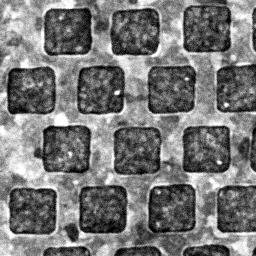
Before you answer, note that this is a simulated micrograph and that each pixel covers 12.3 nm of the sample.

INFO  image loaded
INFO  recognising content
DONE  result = a regular array of holes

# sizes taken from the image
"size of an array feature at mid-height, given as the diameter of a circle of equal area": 659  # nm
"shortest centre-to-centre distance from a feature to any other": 0.83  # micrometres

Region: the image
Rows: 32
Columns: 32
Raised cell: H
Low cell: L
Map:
HHHHHHHHHHHHHHHHHHHHHHHHHHHHHHHH
HHHHHHLLLLLHHHLLLLLLHHHLLLLLLHHH
HHHHHLLLLLLLHHLLLLLLHHHLLLLLLHHL
HHHHHLLLLLLHHHLLLLLLHHHLLLLLLHHL
HHHHHLLLLLLLHHLLLLLLHHHLLLLLLHHL
HHHHHLLLLLLLHHLLLLLLHHHLLLLLLHHL
HHHHHHLLLLLHHHLLLLLLHHHLLLLLHHHH
HHHHHHHHHHHHHHHHHHHHHHHHHHHHHHHH
HHLLLLLHHHLLLLLHHHHLLLLLHHHLLLLL
HLLLLLLHHHLLLLLLHHLLLLLLLHHLLLLL
HLLLLLLHHHLLLLLLHHLLLLLLLHHLLLLL
HLLLLLLHHLLLLLLLHHLLLLLLLHHLLLLL
HLLLLLLHHLLLLLLLHHLLLLLLLHHLLLLL
HLLLLLLHHHLLLLLHHHLLLLLLHHHLLLLL
HHHHHHHHHHHHHHHHHHHHHHHHHHHHHHHH
HHHHHHHHHLHHHHHHHHHHHHHHHHHHHHHH
HHHHHLLLLLLHHHLLLLLLHHHLLLLLLHHL
HHHHHLLLLLLHHHLLLLLLHHHLLLLLLHHL
HHHHHLLLLLLHHHLLLLLLHHHLLLLLLHHL
HHHHHLLLLLLHHHLLLLLLHHHLLLLLLHHL
HHHHHLLLLLLHHHLLLLLLHHHLLLLLLHHL
HHHHHHLLLLLHHHLLLLLLHHHLLLLLHHHH
HHHHHHHHHHHHHHHHHHHHHHHHHHHHHHHH
HHLLLLLHHHLLLLLLHHHLLLLLHHHHLLLL
HLLLLLLHHHLLLLLLHHHLLLLLLHHLLLLL
HLLLLLLHHHLLLLLLHHLLLLLLLHHLLLLL
HLLLLLLHHHLLLLLLHHLLLLLLLHHLLLLL
HLLLLLLHHHLLLLLLHHLLLLLLLHHLLLLL
HLLLLLLHHHLLLLLLHHHLLLLLHHHLLLLL
HHHHHHHHHHHHHHHHHHHHHHHHHHHHHHHH
HHHHHHHHHHHHHHHHHHHHHHHHHHLHHHHH
HHHHHLLLLLLHHHLLLLLLHHHLLLLLLHHH